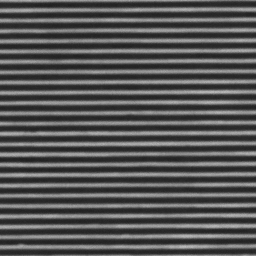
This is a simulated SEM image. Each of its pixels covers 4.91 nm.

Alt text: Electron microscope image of parallel lines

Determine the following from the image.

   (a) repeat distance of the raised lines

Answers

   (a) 50.7 nanometers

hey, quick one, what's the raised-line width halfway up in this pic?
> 0.0246 µm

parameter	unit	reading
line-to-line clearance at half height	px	5.89